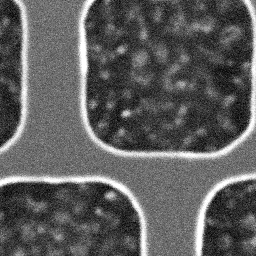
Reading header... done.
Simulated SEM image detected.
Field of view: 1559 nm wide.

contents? holes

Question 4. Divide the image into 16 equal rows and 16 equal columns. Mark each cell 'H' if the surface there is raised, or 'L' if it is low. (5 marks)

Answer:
LHHHHHLLLLLLLLLL
LHHHHLLLLLLLLLLL
LHHHHLLLLLLLLLLL
LHHHHLLLLLLLLLLL
LHHHHLLLLLLLLLLL
LHHHHLLLLLLLLLLL
LHHHHLLLLLLLLLLL
LHHHHLLLLLLLLLLL
LHHHHHLLLLLLLLLH
HHHHHHHHLLLLLLHH
HHHHHHHHHHHHHHHH
LLLLLLLHHHHHHHLL
LLLLLLLLHHHHHLLL
LLLLLLLLLHHHHLLL
LLLLLLLLLHHHHLLL
LLLLLLLLLHHHHLLL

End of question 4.